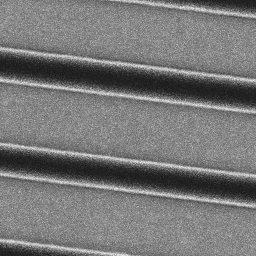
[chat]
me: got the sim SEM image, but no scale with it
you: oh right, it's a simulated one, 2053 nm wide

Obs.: one or a few lines or trenches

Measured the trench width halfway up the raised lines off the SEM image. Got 496 nanometres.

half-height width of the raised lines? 0.259 um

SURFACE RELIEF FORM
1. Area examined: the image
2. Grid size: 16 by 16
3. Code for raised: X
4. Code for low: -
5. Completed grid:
-----------XXXXX
----------------
----------------
XXXX------------
XXXXXXXXXXXX----
----XXXXXXXXXXXX
------------XXXX
----------------
----------------
XXXX------------
XXXXXXXXXXXX----
-----XXXXXXXXXXX
------------XXXX
----------------
----------------
XXXX------------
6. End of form